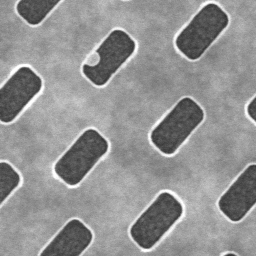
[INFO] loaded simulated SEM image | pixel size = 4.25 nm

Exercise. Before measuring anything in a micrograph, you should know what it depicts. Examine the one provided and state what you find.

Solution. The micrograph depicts holes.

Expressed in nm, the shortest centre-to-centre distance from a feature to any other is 412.